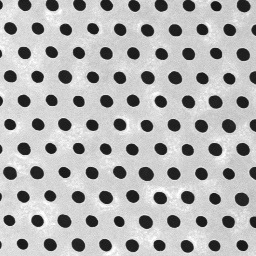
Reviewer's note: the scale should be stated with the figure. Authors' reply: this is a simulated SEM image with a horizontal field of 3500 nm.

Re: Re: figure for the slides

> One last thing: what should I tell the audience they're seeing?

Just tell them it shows a regular array of holes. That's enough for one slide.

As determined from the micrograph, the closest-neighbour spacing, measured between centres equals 368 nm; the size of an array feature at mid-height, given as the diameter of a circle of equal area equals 0.17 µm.